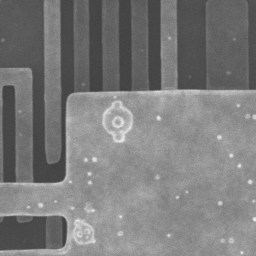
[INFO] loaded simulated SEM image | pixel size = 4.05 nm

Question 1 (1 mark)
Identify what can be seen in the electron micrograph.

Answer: wiring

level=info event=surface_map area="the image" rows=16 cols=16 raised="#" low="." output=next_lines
................
................
................
................
................
................
....############
....############
....############
....############
....############
################
################
....############
....############
....############